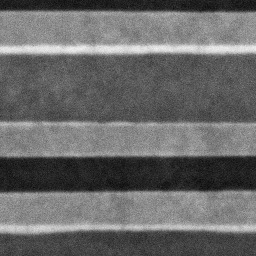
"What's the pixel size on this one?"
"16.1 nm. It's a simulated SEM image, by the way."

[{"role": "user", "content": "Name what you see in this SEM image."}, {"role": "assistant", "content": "lines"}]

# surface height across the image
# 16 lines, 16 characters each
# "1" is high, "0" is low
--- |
0000000000000000
1111111111111111
1111111111111111
0000000000000000
0000000000000000
0000000000000000
0000000000000000
0000000000000000
1111111111111111
1111111111111111
0000000000000000
0000000000000000
1111111111111111
1111111111111111
0000000000000000
0000000000000000